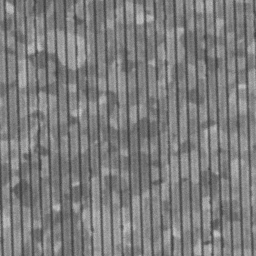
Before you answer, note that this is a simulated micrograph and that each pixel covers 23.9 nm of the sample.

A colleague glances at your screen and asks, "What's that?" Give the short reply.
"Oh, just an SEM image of parallel lines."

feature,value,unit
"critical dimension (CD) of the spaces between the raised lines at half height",102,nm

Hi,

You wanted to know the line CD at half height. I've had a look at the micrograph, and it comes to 143 nm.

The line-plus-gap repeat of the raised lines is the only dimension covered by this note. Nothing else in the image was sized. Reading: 239 nm